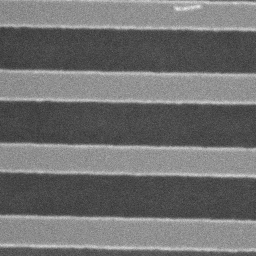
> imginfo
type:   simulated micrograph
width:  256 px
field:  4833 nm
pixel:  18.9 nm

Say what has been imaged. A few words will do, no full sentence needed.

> lines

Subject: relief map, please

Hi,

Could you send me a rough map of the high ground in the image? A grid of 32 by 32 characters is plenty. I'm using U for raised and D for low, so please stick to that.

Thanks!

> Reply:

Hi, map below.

UUUUUUUUUUUUUUUUUUUUUUUUUUUUUUUU
UUUUUUUUUUUUUUUUUUUUUUUUUUUUUUUU
UUUUUUUUUUUUUUUUUUUUUUUUUUUUUUUU
DDDDDDDDDDDDDDUUUUUUUUUUUUUUUUUU
DDDDDDDDDDDDDDDDDDDDDDDDDDDDDDDD
DDDDDDDDDDDDDDDDDDDDDDDDDDDDDDDD
DDDDDDDDDDDDDDDDDDDDDDDDDDDDDDDD
DDDDDDDDDDDDDDDDDDDDDDDDDDDDDDDD
DDDDDDDDDDDDDDDDDDDDDDDDDDDDDDDD
UUUUUUUUUUUUUUUUUUUUUUUUUUUUUUUU
UUUUUUUUUUUUUUUUUUUUUUUUUUUUUUUU
UUUUUUUUUUUUUUUUUUUUUUUUUUUUUUUU
DDDDUUUUUUUUUUUUUUUUUUUUUUUUUUUU
DDDDDDDDDDDDDDDDDDDDDDDDDDDDDDDD
DDDDDDDDDDDDDDDDDDDDDDDDDDDDDDDD
DDDDDDDDDDDDDDDDDDDDDDDDDDDDDDDD
DDDDDDDDDDDDDDDDDDDDDDDDDDDDDDDD
DDDDDDDDDDDDDDDDDDDDDDDDDDDDDDDD
UUUUUUUUUUUUUUUUUUUUUUUUUUDDDDDD
UUUUUUUUUUUUUUUUUUUUUUUUUUUUUUUU
UUUUUUUUUUUUUUUUUUUUUUUUUUUUUUUU
DUUUUUUUUUUUUUUUUUUUUUUUUUUUUUUU
DDDDDDDDDDDDDDDDDDDDDDDDDDDDDDDD
DDDDDDDDDDDDDDDDDDDDDDDDDDDDDDDD
DDDDDDDDDDDDDDDDDDDDDDDDDDDDDDDD
DDDDDDDDDDDDDDDDDDDDDDDDDDDDDDDD
DDDDDDDDDDDDDDDDDDDDDDDDDDDDDDDD
UUUUUUUUUUUUUUUUUUUUUUUUUUUDDDDD
UUUUUUUUUUUUUUUUUUUUUUUUUUUUUUUU
UUUUUUUUUUUUUUUUUUUUUUUUUUUUUUUU
UUUUUUUUUUUUUUUUUUUUUUUUUUUUUUUU
DDDDDDDDDDDDDDDDDDDDDDDDDDDDDDDD